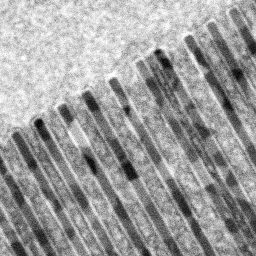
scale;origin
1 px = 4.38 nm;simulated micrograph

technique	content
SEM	parallel lines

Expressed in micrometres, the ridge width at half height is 0.0568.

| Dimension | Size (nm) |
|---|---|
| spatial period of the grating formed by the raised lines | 121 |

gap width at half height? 65.4 nm